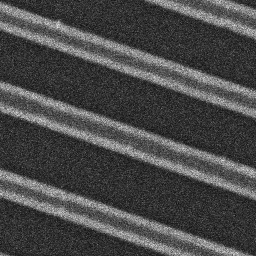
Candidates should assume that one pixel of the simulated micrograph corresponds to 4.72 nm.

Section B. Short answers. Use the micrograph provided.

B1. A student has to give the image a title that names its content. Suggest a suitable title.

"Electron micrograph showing one or a few lines or trenches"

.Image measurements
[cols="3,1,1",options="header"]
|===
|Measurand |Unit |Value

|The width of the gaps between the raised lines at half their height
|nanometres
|266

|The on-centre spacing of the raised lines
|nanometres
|368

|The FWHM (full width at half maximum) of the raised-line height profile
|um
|0.0926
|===